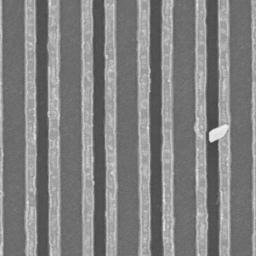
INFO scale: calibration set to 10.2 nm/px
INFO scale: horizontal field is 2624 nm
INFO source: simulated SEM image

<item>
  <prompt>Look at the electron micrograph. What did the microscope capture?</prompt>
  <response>parallel lines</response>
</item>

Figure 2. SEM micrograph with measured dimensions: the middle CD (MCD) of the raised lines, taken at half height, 105 nm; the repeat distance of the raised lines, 282 nm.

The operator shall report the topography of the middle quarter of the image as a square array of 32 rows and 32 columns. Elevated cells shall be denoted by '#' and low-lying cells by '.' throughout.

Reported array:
.....##...###......##...###.....
.....##...###......##...###.....
.....##...###......##....##.....
.....##...###......##....##.....
.....##...###......##....##.....
.....##...###......##....##.....
.....##...###......##....##.....
.....##...###......##....##.....
.....##...###......##....##.....
.....##...###......##....##.....
.....##...###......##....##.....
.....##...###......##....##.....
.....##...###......##....##.....
.....##...###......##....##.....
.....##...###......##....##.....
.....##...###......##....##.....
.....##...###......##....##.....
.....##...###......##....##.....
.....##...###......##....##.....
.....##...###......##....##.....
.....##...###......##....##.....
.....##...###......##....##.....
.....##....##......###...##.....
.....##...###......###...##.....
.....##...###......##...###.....
.....##....##......##....##.....
.....##....##......##....##.....
.....##....##......###...##.....
.....##...###......##....##.....
.....##...###......##....##.....
.....##...###......##....##.....
.....##...###......##....##.....